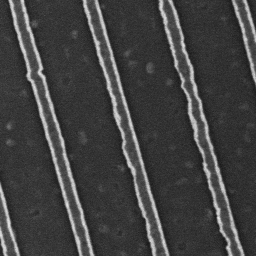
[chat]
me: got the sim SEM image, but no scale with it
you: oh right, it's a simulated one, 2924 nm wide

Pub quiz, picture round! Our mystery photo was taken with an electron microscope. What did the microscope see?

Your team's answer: one or a few lines or trenches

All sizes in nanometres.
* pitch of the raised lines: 820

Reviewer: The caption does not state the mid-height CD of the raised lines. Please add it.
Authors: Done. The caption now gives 133 nanometers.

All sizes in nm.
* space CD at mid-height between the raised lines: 687